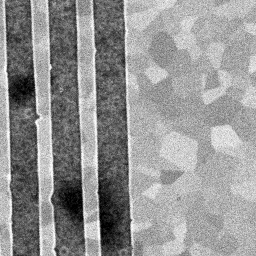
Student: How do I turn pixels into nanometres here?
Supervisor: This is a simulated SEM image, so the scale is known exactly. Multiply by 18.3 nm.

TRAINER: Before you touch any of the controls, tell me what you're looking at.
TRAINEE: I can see parallel lines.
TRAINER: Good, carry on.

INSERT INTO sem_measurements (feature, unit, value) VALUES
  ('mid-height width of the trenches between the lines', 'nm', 541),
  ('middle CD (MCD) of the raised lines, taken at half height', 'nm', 254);